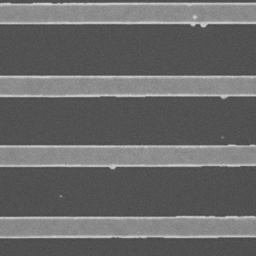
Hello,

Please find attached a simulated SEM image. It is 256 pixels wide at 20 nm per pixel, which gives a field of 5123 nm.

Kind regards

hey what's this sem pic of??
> lines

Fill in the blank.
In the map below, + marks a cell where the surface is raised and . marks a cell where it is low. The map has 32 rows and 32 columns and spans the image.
...............+++++++++++++++++
++++++++++++++++++++++++++++++++
++++++++++++++++++++++++++++++++
................................
................................
................................
................................
................................
................................
................................
++++++++++++++++++++++++++++++++
++++++++++++++++++++++++++++++++
................................
................................
................................
................................
................................
................................
++++++++++++++++++++++++++++++++
++++++++++++++++++++++++++++++++
++++++++++++++++++++++++++++++++
................................
................................
................................
................................
................................
................................
++++++++++++++++++++++++++++++++
++++++++++++++++++++++++++++++++
++++++++++++++++++++++++++++++++
................................
................................